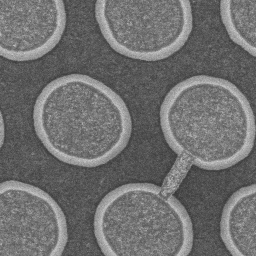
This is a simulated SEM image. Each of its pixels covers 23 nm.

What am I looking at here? raised bodies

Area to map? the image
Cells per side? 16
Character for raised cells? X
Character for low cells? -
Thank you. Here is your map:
XXXX--XXXXXX--XX
XXXX--XXXXXX--XX
XXX----XXXX----X
-X--------------
----------------
---XXX-----XXX--
--XXXXX---XXXXX-
--XXXXXX--XXXXXX
---XXXXX---XXXXX
---XXXX----XXXX-
-----------X----
----------X-----
XXX----XXXX----X
XXXX--XXXXX---XX
XXXX--XXXXXX--XX
XXXX---XXXXX--XX